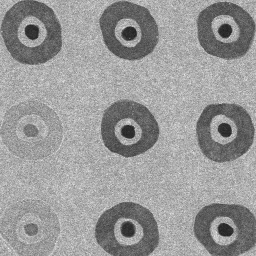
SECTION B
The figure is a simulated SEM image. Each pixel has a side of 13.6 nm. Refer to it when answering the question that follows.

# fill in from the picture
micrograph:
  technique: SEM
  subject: ring-shaped grooves with a dot in the middle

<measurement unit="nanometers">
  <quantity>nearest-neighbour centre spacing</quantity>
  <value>1310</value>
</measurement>